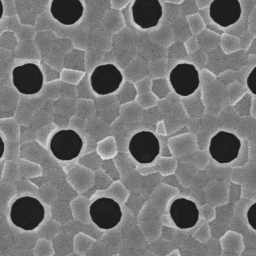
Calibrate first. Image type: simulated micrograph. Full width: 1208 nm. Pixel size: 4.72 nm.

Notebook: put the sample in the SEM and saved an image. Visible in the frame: a regular array of holes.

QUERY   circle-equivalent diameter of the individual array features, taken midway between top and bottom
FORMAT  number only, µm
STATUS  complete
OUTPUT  0.147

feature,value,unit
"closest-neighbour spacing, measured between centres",77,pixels